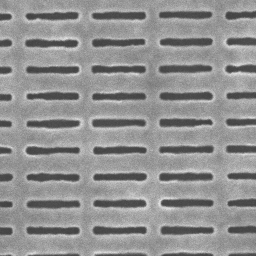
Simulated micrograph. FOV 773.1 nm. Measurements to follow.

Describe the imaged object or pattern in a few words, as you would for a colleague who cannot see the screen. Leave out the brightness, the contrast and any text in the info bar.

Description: a regular array of holes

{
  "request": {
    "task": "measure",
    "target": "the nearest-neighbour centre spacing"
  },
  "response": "0.0809 microns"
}